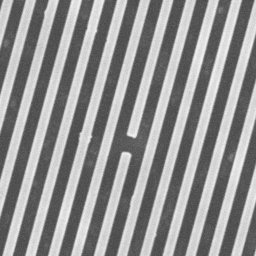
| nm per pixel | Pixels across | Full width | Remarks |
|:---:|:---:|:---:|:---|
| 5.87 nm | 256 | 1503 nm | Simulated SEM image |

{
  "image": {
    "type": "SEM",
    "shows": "parallel lines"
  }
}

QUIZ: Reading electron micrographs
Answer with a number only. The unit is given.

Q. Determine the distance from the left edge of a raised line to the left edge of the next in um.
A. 0.13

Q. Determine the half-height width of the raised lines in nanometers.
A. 53.8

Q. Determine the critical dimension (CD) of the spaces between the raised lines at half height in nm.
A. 73.7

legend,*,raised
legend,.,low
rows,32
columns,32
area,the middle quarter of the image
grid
...***...**....**...***...**....
...**....**...***...***...**....
...**....**...**....**....**...*
..***...***...**....**...***...*
..**....**....**...***...**....*
..**....**...***...**....**....*
..**...***...**....**...***...**
.***...**....**....**...***...**
.**....**...***...***...**....**
.**....**...***...**....**...***
.**...***...**....**...***...***
***...**....**....**...**....**.
**....**...***...***...**....**.
**....**...**....**....**...***.
**...***...**....**...***...**..
*....**....**...***...**....**..
*....**...***...**....**....**..
*...***...**....**....**...***..
*...***...**.........***...**...
....**....**.........**....**...
....**...***.........**....**...
...***...**.........***...***...
...**....**....*....**....**....
...**...***...***...**....**...*
...**...**....**....**...***...*
..***...**....**...***...***...*
..**....**...***...**....**....*
..**...***...***...**....**...**
.***...**....**....**...***...**
.***...**....**...***...**....**
.**....**...***...**....**...***
.**...***...**....**....**...**.